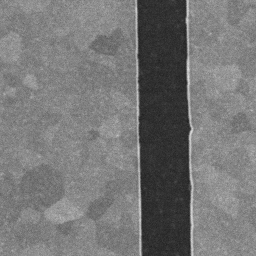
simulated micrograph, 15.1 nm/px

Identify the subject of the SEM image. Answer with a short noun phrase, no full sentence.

one or a few lines or trenches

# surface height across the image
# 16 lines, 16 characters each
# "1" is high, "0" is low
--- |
1111111110001111
1111111110001111
1111111110001111
1111111110001111
1111111110001111
1111111110001111
1111111110001111
1111111110001111
1111111110001111
1111111110001111
1111111110001111
1111111110001111
1111111110001111
1111111110001111
1111111110001111
1111111110001111